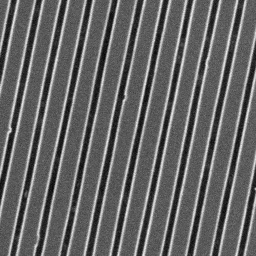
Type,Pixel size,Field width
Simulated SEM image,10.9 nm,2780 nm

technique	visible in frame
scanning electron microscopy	parallel lines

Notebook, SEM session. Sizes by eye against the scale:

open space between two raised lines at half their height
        77.2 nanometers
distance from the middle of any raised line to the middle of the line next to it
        269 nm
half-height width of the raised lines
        193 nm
